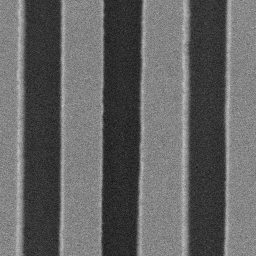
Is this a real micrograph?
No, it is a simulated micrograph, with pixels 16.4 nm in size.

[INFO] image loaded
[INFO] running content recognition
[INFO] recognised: lines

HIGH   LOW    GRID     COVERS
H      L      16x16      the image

HLLLHHLLLHHHLLHH
HLLLHHLLLHHHLLHH
HLLLHHLLLHHHLLHH
HLLLHHLLLHHLLLHH
HLLLHHLLLHHHLLHH
HLLLHHLLLHHHLLHH
HLLLHHLLLHHLLLHH
HLLLHHLLLHHLLLHH
HLLLHHLLLHHLLLHH
HLLLHHLLLHHLLLHH
HLLLHHLLLHHLLLHH
HLLLHHLLLHHLLLHH
HLLLHHLLLHHLLLHH
HLLLHHLLLHHLLLHH
HLLLHHLLLHHLLLHH
HLLLHHLLLHHLLLHH